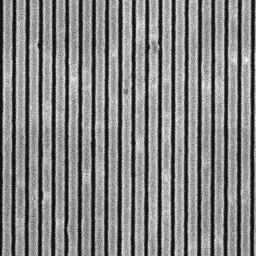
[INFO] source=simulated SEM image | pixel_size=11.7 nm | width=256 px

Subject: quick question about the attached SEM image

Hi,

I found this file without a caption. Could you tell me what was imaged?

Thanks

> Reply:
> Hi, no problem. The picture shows parallel lines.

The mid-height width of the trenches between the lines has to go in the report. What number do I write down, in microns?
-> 0.0423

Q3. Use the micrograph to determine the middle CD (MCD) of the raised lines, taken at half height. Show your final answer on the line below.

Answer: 9.01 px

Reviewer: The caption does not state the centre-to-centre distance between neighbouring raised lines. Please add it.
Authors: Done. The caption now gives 155 nm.